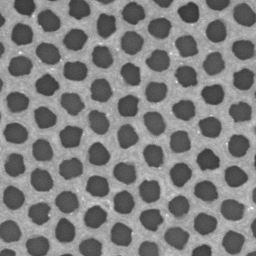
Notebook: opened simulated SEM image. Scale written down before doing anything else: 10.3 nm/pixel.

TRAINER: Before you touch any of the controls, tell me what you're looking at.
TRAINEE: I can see a regular array of holes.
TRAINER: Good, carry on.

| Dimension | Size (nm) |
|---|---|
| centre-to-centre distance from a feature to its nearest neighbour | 316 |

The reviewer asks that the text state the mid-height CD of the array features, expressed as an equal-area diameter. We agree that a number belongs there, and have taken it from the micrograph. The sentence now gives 22.9 px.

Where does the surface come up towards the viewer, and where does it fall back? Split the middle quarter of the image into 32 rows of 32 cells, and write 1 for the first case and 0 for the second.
00000011000011100011100000111000
00000011111111000001110000110000
00000011111111000001111111100000
00000111111111100001111111110000
11111110000111100001100011111000
11111110000011110111100000111000
11111110000011111111000000111111
00001110000011111111000000111111
00001110000011000001100001111111
00000111100110000001100011111000
00000111111110000011111111100000
00000110111110000001111111100000
10001100001111000011000011100000
11111000000111111111000001110000
11111100000011111111000000111111
10001100000111000111000000111111
00001110000110000011100001111111
00000111001110000011100011100001
00001111111110000001111111000000
00001111011111000001111111000000
00001110001111000111100011000000
11111100000111111111000001100001
11111100000111111111000001111111
00011100000111111111000001111111
00001100000111010111000001111111
00000111111110000011100001100001
00000111111100000011111111100000
00001111111100000011111111000000
00011100001110000011111111100000
11111100000111000111000011100001
11111100000111111110000011110011
11111100000111111110000011111111